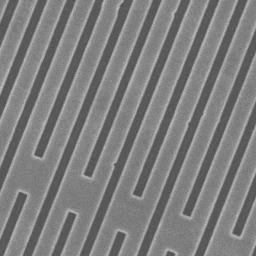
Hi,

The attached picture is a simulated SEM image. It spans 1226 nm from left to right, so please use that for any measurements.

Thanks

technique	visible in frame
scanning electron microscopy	parallel lines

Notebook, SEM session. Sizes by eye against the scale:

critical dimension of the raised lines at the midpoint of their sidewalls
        0.0768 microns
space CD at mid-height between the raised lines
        50.7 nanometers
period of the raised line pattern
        26.6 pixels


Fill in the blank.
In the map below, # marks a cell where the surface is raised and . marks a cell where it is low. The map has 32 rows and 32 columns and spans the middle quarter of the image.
#...####...####...####...#####..
#..#####...####...####...####...
...####...#####..#####...####...
...####...####...####...####...#
..#####..#####...####...####...#
..####...#####..####...#####..##
.#####...####...####...####...##
.####...#####..#####...####...##
.####...####...####...####...###
#####..#####...####...####...###
####...#####..####...#####..####
####...####...####...####...####
###...#####..#####...####...####
###...####...####...#####..#####
###..#####...####...####...####.
##...#####..####...#####...####.
##...####...####...####...####..
#...#####..#####...####...####..
#...####...####...####...#####..
#..#####...####...####...####...
...#####..####...#####...####...
...####...####...####...####...#
..#####..#####...####...####...#
..####...####...####...#####..##
.#####...####...####...####...##
.#####..####...#####...####...##
.####...####...####...####...###
#####..#####...####...####...###
###########...####...#####...###
###########...####...####...####
###########..#####...####...####
##########...####...####...#####